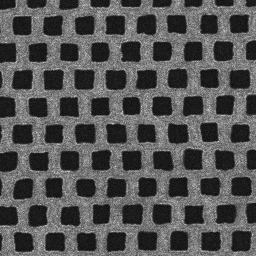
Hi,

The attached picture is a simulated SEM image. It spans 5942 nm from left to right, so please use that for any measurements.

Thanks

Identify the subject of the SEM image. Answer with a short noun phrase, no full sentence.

a regular array of holes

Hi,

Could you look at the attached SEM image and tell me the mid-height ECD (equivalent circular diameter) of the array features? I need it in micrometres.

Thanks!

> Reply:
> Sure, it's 0.488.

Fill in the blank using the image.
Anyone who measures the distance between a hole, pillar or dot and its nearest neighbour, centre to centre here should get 704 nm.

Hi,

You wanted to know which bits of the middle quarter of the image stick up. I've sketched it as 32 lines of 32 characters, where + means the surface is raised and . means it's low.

++++++++++++++++++++++++++++++++
+++.++++++++++.++++....++++...++
+++.....++......++.....+++.....+
++......++......++.....+++.....+
++......++......++.....+++.....+
+++.....+++.....++.....+++.....+
+++++++++++...++++++.+++++++++++
++++++++++++++++++++++++++++++++
...+++++...++++....+++.....+++..
....+++....++++....+++.....+++..
....+++....++++....+++.....+++..
....+++....++++....+++.....+++..
....+++....++++....+++.....+++..
++++++++++++++++++++++++++++++++
++++++++++++++++++++++++++++++++
+++.....+++....++++....+++.....+
+++.....+++.....++.....+++.....+
+++.....+++.....++.....+++.....+
+++.....+++.....++.....+++.....+
+++.....+++....++++....+++.....+
++++++++++++++++++++++++++++++++
++++++++++.+++++++++++++++++++..
....+++.....+++....+++.....+++..
....+++.....+++....+++.....+++..
....+++.....+++.....++.....+++..
....+++.....+++.....++.....+++..
...++++....++++....++++++..++++.
++++++++++++++++++++++++++++++++
+++++++++++++++++++...+++++....+
+++.....+++....+++.....+++.....+
+++.....+++.....++.....+++.....+
+++.....+++.....++.....+++.....+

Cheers